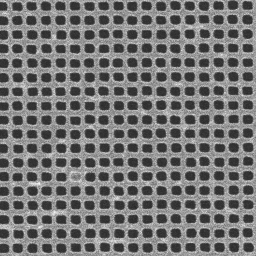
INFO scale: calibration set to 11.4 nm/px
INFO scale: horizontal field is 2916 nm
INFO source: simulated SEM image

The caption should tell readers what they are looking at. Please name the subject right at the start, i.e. a regular array of holes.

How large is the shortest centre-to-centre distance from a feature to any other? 157 nm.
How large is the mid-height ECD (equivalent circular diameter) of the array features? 0.123 µm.